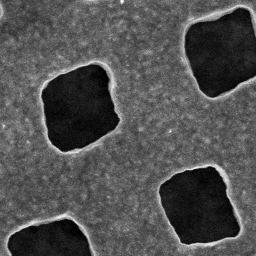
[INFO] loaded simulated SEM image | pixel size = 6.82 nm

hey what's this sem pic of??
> holes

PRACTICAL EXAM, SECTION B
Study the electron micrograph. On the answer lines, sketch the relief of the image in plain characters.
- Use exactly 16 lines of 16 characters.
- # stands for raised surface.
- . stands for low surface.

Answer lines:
################
############....
############....
############....
####...#####....
###....#####...#
###....#########
###....#########
###....#########
################
################
##########....##
##########....##
##########.....#
#....######....#
#.....##########